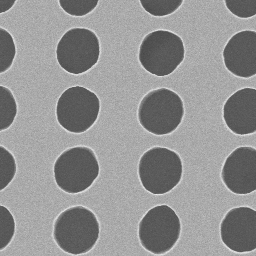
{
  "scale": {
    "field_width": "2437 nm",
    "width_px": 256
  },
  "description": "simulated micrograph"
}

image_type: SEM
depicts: a regular array of holes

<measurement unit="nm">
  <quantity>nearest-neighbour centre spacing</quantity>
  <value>560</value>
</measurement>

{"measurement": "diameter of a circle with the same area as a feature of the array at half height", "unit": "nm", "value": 423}